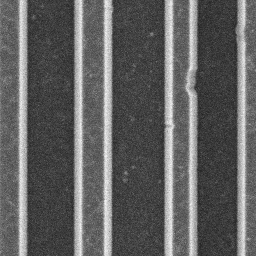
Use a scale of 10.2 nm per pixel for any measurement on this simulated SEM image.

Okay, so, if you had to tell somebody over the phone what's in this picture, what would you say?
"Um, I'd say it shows one or a few lines or trenches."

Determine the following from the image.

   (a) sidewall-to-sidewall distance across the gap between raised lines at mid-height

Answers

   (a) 53.5 pixels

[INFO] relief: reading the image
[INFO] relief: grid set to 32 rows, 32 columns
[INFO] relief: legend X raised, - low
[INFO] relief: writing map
XXX-------XXXX-------XXX------XX
XXX-------XXXX-------XXX------XX
XXX-------XXX--------XXX------XX
XXX-------XXX--------XXX------XX
XXX-------XXX--------XXX------XX
XXX-------XXX--------XXX------XX
XXX-------XXX--------XXX------XX
XXX-------XXX--------XXX------XX
XXX-------XXX--------XXX------XX
XXX-------XXX--------XXX------XX
XXX-------XXX--------XXX------XX
XXX-------XXX--------XXX------XX
XXX-------XXX--------XXX------XX
XXX-------XXX--------XXX------XX
XXX-------XXX--------XXX------XX
XXX-------XXX--------XXX------XX
XXX-------XXX--------XXX------XX
XXX-------XXX--------XXX------XX
XXX-------XXX--------XXX------XX
XXX-------XXX--------XXX------XX
XXX-------XXX--------XXX------XX
XXX-------XXX--------XXX------XX
XXX-------XXX--------XXX------XX
XXX-------XXX--------XXX------XX
XXX-------XXX--------XXX------XX
XXX-------XXX--------XXX------XX
XXX-------XXX--------XXX------XX
XXX-------XXX--------XXX------XX
XXX-------XXX--------XXX------XX
XXX-------XXX--------XXX------XX
XXX-------XXX--------XXX------XX
XXX-------XXX--------XXX------XX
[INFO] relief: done